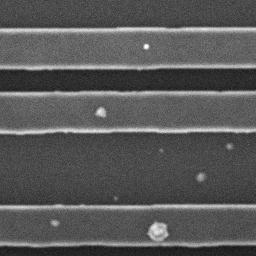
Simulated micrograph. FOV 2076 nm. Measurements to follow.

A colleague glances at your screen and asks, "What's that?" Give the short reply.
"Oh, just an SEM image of lines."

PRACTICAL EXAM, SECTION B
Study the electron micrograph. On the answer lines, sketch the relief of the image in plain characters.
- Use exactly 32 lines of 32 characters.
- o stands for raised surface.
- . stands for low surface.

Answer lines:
................................
................................
................................
................................
oooooooooooooooooooooooooooooooo
oooooooooooooooooooooooooooooooo
oooooooooooooooooooooooooooooooo
oooooooooooooooooooooooooooooooo
oooooooooooooooooooo............
................................
................................
......oo..ooooo...oooooooooooooo
oooooooooooooooooooooooooooooooo
oooooooooooooooooooooooooooooooo
oooooooooooooooooooooooooooooooo
oooooooooooooooooooooooooooooooo
ooooooo..ooooo.....ooooo.....oo.
................................
................................
................................
................................
................................
................................
................................
................................
................................
oooooooooooooooooooooooooooooooo
oooooooooooooooooooooooooooooooo
oooooooooooooooooooooooooooooooo
oooooooooooooooooooooooooooooooo
oooooooooooooooooooooooooooooooo
................................